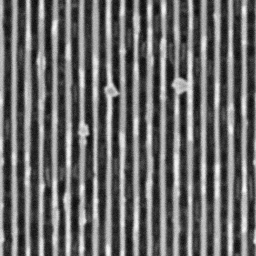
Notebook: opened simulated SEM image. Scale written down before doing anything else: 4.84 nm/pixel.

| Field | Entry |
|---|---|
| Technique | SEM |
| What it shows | parallel lines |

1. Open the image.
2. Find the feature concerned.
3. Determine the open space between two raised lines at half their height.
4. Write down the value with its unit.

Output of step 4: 43 nm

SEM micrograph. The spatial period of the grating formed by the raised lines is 65.7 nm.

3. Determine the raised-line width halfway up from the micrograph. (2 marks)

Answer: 0.0236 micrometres